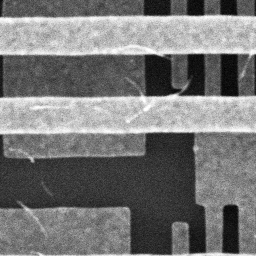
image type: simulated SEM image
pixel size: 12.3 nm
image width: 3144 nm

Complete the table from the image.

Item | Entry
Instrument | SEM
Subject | wiring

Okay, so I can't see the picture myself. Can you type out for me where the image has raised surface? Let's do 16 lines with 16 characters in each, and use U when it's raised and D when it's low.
DDDDDDDDDDDDDDDD
UUUUUUUUUUUUUUUU
UUUUUUUUUUUUUUUU
DDDDDDDDDDDDDDDD
DDDDDDDDDDDDDDDD
DDDDDDDDDDDDDDDD
UUUUUUUUUUUUUUUU
UUUUUUUUUUUUUUUU
DDDDDDDDDDDDDDDD
DDDDDDDDDDDDDDDD
DDDDDDDDDDDDDDDD
DDDDDDDDDDDDDDDD
DDDDDDDDDDDDDDDD
DDDDDDDDDDDDDDDD
DDDDDDDDDDDDDDDD
DDDDDDDDDDDDDDDD